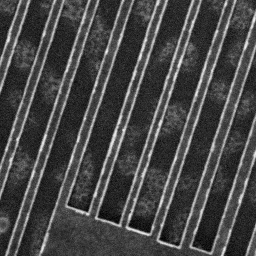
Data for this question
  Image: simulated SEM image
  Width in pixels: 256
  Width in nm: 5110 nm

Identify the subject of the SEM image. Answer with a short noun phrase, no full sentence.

parallel lines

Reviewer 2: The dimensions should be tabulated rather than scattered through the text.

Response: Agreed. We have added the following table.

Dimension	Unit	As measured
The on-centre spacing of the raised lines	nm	652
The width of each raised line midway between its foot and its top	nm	185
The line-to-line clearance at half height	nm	470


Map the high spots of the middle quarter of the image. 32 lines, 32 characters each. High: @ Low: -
-@@------@@@------@@-------@@---
@@@------@@@------@@------@@@---
@@@------@@------@@@------@@----
@@------@@@------@@-------@@----
@@------@@@------@@------@@@----
@@------@@------@@@------@@-----
@------@@@------@@@------@@-----
@------@@@------@@-------@@-----
@------@@------@@@------@@------
-------@@------@@@------@@------
------@@@------@@-------@@------
------@@-------@@------@@-------
------@@------@@@------@@------@
-----@@@------@@------@@@------@
-----@@-------@@------@@-------@
----@@@------@@-------@@------@@
----@@@------@@-------@@------@@
----@@-------@@------@@-------@@
----@@------@@@------@@------@@@
---@@@------@@-------@@------@@-
---@@-------@@------@@-------@@-
---@@------@@@------@@-------@@-
--@@@------@@-------@@------@@--
--@@-------@@------@@-------@@--
--@@------@@@------@@------@@@--
-@@@------@@-------@@------@@---
-@@-------@@------@@-------@@---
-@@------@@@------@@------@@@---
@@@------@@-------@@------@@----
@@-------@@-------@-------@@----
@@------@@@------@@------@@@----
@@------@@-------@@------@@-----